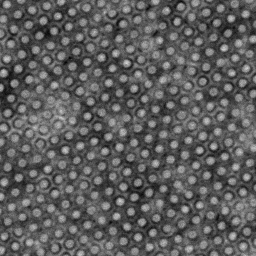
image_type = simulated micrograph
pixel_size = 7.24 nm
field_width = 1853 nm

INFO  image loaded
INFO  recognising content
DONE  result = a regular array of raised bodies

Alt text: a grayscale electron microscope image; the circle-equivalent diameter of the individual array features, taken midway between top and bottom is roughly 54.8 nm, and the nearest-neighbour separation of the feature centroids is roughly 0.107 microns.